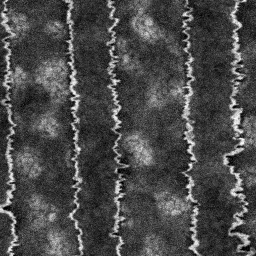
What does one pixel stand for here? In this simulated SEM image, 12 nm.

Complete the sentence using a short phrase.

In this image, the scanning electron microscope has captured one or a few lines or trenches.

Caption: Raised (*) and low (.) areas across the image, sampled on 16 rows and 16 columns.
....***.....***.
....***.....***.
....***.....***.
*...***.....***.
....***.....***.
.....**.....***.
*....**.....***.
*....**.....***.
*....**.....***.
*....**.....***.
*....**.....**..
*....**.....***.
*....**.....***.
*....**.....***.
*....**.....***.
*....**.....***.